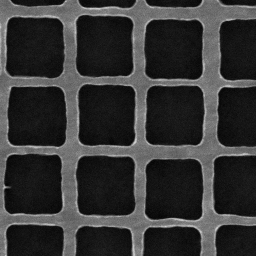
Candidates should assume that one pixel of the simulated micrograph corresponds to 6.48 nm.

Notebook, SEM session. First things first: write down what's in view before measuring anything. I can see a regular array of holes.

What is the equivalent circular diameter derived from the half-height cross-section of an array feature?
0.425 micrometres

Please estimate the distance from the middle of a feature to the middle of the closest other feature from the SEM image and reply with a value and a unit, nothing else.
0.438 µm